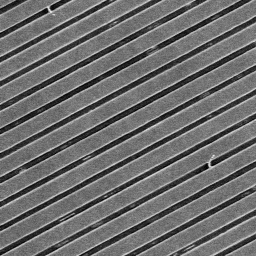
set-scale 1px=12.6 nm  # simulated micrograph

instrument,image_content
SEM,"parallel lines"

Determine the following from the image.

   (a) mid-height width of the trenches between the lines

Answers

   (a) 70.6 nm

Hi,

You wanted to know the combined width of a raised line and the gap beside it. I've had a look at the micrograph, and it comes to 267 nm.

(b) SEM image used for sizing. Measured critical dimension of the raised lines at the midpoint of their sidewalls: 199 nm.